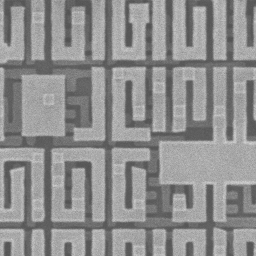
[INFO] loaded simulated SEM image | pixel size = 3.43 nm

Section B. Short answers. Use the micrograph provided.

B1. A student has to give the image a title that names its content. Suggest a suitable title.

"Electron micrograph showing wiring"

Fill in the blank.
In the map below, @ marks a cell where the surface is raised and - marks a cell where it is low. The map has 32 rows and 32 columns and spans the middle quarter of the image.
--------------------------------
-------@@@--@@@@@@@@--@@@--@@@@@
-------@@@--@@@@@@@@--@@@--@@@@@
-------@@@--@@@@@@@@--@@@--@@@@@
-------@@@--@@@--@@@--@@@--@@@--
-------@@@--@@@--@@@--@@@--@@@--
-------@@@--@@@--@@@--@@@--@@@--
-------@@@--@@@--@@@--@@@--@@@--
-------@@@--@@@--@@@--@@@--@@@--
-------@@@--@@@--@@@--@@@--@@@--
-------@@@--@@@--@@@--@@@--@@@--
-------@@@--@@@--@@@--@@@--@@@--
-------@@@--@@@--@@@--@@@--@@@--
-------@@@--@@@--@@@--@@@--@@@--
-------@@@--@@@-------@@@--@@@--
-------@@@--@@@-------@@@--@@@--
---@@@@@@@--@@@@@@@@@-@@@--@@@--
---@@@@@@@--@@@@@@@@@@----------
---@@@@@@@--@@@@@@@@@@----------
------------------------@@@@@@@@
------------------------@@@@@@@@
@@@@@@@@@@--@@@@@@@@@---@@@@@@@@
@@@@@@@@@@--@@@@@@@@@---@@@@@@@@
@@@@@@@@@@--@@@@@@@@@---@@@@@@@@
-------@@@--@@@@--------@@@@@@@@
-------@@@--@@@---------@@@@@@@@
--@@@--@@@--@@@--@@@----@@@@@@@@
--@@@--@@@--@@@--@@@----@@@@@@@@
--@@@--@@@--@@@--@@@----@@@@@@@@
--@@@--@@@--@@@--@@@----@@@@@@@@
--@@@--@@@--@@@--@@@------------
--@@@--@@@--@@@--@@@------------